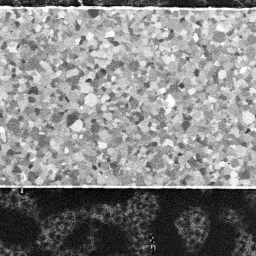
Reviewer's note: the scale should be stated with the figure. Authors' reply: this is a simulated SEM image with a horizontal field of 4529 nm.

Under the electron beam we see one or a few lines or trenches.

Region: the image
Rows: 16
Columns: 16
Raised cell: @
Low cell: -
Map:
@--@---@@-------
@@@@@@@@@@@@@@@@
@@@@@@@@@@@@@@@@
@@@@@@@@@@@@@@@@
@@@@@@@@@@@@@@@@
@@@@@@@@@@@@@@@@
@@@@@@@@@@@@@@@@
@@@@@@@@@@@@@@@@
@@@@@@@@@@@@@@@@
@@@@@@@@@@@@@@@@
@@@@@@@@@@@@@@@@
@@@@@@@@@@@@@@@@
----------------
----------------
----------------
----------------